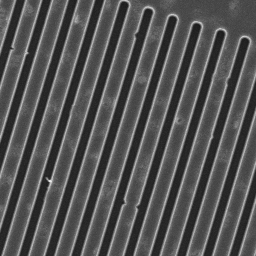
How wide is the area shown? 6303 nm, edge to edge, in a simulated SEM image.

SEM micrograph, parallel lines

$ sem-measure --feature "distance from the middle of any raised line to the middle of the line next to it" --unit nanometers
620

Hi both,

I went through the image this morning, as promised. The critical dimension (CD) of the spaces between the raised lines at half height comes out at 227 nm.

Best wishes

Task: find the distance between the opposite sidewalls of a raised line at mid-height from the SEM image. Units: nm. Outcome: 383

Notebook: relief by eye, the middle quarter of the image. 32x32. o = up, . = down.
ooo..oooo...oooo..oooo...oooo..o
ooo..oooo...oooo..oooo...oooo..o
oo...oooo..oooo...oooo..oooo...o
oo..oooo...oooo..ooooo..oooo...o
oo..oooo...oooo..oooo...oooo..oo
o...oooo..oooo...oooo...oooo..oo
o..oooo...oooo...oooo..oooo...oo
o..oooo...oooo..oooo...oooo..ooo
...oooo...oooo..oooo...oooo..ooo
...oooo..oooo...oooo..oooo...ooo
..oooo...oooo..oooo...oooo...ooo
..oooo..oooo...oooo...oooo..oooo
..oooo..oooo...oooo..ooooo..oooo
.oooo...oooo...oooo..oooo...oooo
.oooo...oooo..oooo...oooo..oooo.
.oooo..oooo...oooo...oooo..oooo.
ooooo..oooo...oooo..oooo...oooo.
oooo...oooo..oooo...oooo..oooo..
oooo...ooo...oooo...oooo..oooo..
oooo..oooo...oooo..oooo...oooo..
ooo...oooo..oooo...oooo...oooo..
ooo...ooo...oooo...oooo..oooo...
ooo..oooo...oooo...oooo..oooo...
oo...oooo...oooo..oooo...oooo..o
oo...oooo..oooo...oooo..oooo...o
oo..oooo...oooo...oooo..oooo...o
oo..oooo...oooo..oooo...oooo..oo
o...oooo..oooo...oooo..ooooo..oo
o...ooo...oooo...oooo..oooo...oo
o..oooo...oooo..oooo...oooo...oo
...oooo..oooo...oooo...oooo..ooo
...oooo..oooo...oooo..oooo...ooo